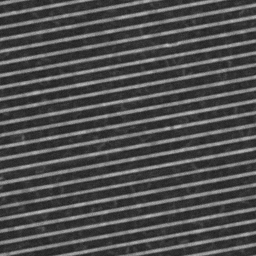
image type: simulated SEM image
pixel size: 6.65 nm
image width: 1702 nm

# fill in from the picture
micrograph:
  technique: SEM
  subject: parallel lines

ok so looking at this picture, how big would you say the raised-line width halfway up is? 13.9 nanometres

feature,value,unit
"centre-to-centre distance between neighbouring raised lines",11.8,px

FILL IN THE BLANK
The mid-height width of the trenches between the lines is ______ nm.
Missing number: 63.8